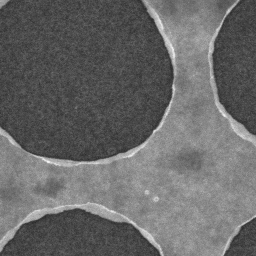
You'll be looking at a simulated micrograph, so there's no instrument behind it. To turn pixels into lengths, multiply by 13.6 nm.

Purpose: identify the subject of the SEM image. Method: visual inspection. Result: holes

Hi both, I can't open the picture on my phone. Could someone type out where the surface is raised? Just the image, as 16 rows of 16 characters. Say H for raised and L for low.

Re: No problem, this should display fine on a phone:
LLLLLLLLLHHHHHHL
LLLLLLLLLLHHHHLL
LLLLLLLLLLHHHLLL
LLLLLLLLLLLHHLLL
LLLLLLLLLLLHHLLL
LLLLLLLLLLLHHLLL
LLLLLLLLLLLHHHLL
LLLLLLLLLLHHHHLL
HLLLLLLLLHHHHHHH
HHLLLLLLHHHHHHHH
HHHHHHHHHHHHHHHH
HHHHHHHHHHHHHHHH
HHHHHHHHHHHHHHHH
HHLLLLLLHHHHHHHH
HLLLLLLLLHHHHHHL
LLLLLLLLLLHHHHLL